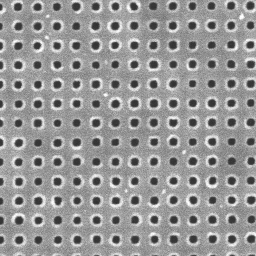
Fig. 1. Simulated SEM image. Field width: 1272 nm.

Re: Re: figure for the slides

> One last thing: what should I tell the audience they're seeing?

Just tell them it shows a regular array of holes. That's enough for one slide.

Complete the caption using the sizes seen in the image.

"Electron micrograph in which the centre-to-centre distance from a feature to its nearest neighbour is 94.9 nanometers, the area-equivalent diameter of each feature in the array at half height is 41.2 nm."